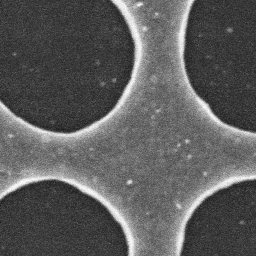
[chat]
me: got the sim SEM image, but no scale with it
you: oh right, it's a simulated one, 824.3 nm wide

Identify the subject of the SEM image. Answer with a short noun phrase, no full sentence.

holes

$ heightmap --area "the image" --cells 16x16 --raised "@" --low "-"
--------@@@@----
--------@@@@----
---------@@-----
---------@@-----
--------@@@@----
--------@@@@----
-------@@@@@@---
@-----@@@@@@@@--
@@@@@@@@@@@@@@@@
@@@@@@@@@@@@@@@@
@@@@@@@@@@@@@@@@
@----@@@@@@@@@--
------@@@@@@@---
-------@@@@@----
--------@@@-----
--------@@@-----